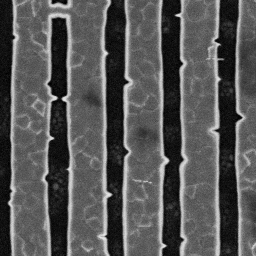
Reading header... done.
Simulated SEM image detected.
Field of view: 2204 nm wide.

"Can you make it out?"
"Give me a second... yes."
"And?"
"parallel lines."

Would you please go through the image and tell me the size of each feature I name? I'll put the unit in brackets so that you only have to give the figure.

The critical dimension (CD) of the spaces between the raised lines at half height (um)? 0.168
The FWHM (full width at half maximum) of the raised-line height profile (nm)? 321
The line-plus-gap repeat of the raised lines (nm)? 486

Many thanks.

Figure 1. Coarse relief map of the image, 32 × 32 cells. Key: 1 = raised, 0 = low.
00111110111111001111000111100011
00111111111110001111000111100011
00111100111110001111000111100011
00111100111110001111000111100011
00111100011110001111000111100011
00111100011110001111000111100011
00111100011110001111000111100011
00111100111110001111000111100011
00111100111110001111000111100011
01111100011110001111000111100011
01111100011110001111000111100011
01111100111110001111000111100011
00111110111110001111000111100011
00111100111110001111000111100011
01111100111110001111000111100011
01111100011110001111000111100011
01111100011110001111000111100011
01111100011110001111000111100011
01111100011110001111000111100111
01111100011110001111100111100111
01111100011110001111100111100111
01111100011110001111000111100011
01111100011110001111000111100011
01111100011110001111000111100011
01111100011111001111000111100011
01111100011110001111000111100011
01111100011110001111000111100011
01111100011110001111000111100011
01111100011110001111000111100011
01111100011110001111000111100011
00111100011110001111000111100011
00111100011110001111000111100011